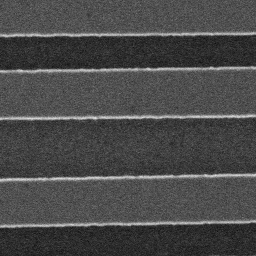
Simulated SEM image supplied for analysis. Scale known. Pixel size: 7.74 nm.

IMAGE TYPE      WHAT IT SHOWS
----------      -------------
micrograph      lines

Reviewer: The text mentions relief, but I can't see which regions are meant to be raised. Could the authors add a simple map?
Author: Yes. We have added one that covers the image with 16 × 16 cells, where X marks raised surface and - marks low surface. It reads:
XXXXXXXXXXXXXXXX
XXXXXXXXXXXXXXXX
----------------
----------------
XXXXXXXXXXXXXXXX
XXXXXXXXXXXXXXXX
XXXXXXXXXXXXXXXX
----------------
----------------
----------------
----------------
XXXXXXXXXXXXXXXX
XXXXXXXXXXXXXXXX
XXXXXXXXXXXXXXXX
----------------
----------------